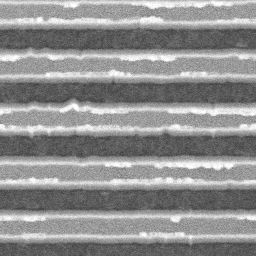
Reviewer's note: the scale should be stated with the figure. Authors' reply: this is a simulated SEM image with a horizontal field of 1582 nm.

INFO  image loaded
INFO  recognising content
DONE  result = parallel lines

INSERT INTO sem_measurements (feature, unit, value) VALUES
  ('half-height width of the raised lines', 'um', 0.158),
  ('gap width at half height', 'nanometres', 175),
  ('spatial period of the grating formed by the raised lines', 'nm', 331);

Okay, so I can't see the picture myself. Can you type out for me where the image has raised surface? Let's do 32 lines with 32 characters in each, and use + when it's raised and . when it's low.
++++++++++++++++++++++++++++++++
++++++++++++++++++++++++++++++++
++++++++++++++++++++++++++++++++
................................
................................
................................
...+............................
++++++++++++++++++++++++++++++++
++++++++++++++++++++++++++++++++
++++++++++++++++++++++++++++++++
................................
................................
................................
++++++++++++++++++++++++++++++++
++++++++++++++++++++++++++++++++
++++++++++++++++++++++++++++++++
+++++.++..+++++++......+..+.....
................................
................................
................................
++++++++++++++++++++++++++++++++
++++++++++++++++++++++++++++++++
++++++++++++++++++++++++++++++++
................................
................................
................................
................................
++++++++++++++++++++++++++++++++
++++++++++++++++++++++++++++++++
++++++++++++++++++++++++++++++++
................................
................................